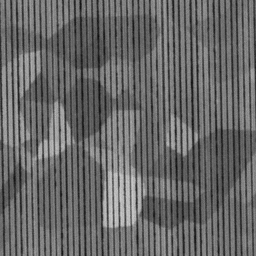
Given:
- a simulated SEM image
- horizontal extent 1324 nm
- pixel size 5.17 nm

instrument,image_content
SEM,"parallel lines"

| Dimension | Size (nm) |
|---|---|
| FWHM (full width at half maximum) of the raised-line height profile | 17.4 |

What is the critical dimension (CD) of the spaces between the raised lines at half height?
12.9 nm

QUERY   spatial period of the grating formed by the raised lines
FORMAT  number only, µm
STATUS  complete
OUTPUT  0.0299